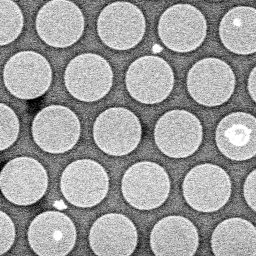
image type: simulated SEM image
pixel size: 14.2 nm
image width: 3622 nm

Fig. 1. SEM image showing an array of small figures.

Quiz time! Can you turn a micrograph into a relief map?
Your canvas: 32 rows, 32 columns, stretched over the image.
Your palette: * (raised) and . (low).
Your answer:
**....***.....**................
***..*****...*****...****....***
***..*****..******..******..****
***..*****..******..******.*****
**...*****..******..******..****
*.....***....****....****...****
...*.........................***
.*****...****....***.....**.....
.*****..******..*****...*****...
.*****..******..******..*****..*
.*****..******..******.******..*
.*****...****...*****...*****..*
..........**.....***....****....
*.....**........................
**...****...*****...****....***.
**..******..*****...*****..*****
**..******..******.******..*****
**..******..*****..******..*****
*....****....****...*****..*****
.....................**.....***.
.****....***.....**.............
******..*****...*****...****....
******..*****..******..******..*
******..*****..******..******..*
.****...*****...*****..******..*
..**.....***....****....****...*
................................
*...*****...****....***.....**..
**..*****..******..*****...*****
**..*****..******..******..*****
*...*****..******..******.******
*...*****...****...*****...*****